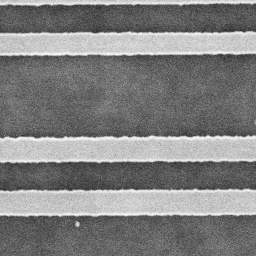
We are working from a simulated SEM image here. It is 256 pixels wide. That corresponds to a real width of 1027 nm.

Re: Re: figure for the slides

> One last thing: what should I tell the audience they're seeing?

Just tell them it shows lines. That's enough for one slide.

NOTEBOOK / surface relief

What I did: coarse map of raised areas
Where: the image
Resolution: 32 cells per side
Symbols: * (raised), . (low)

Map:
*******.*....*........*.........
................................
................................
................................
********************************
********************************
********************************
................................
................................
................................
................................
................................
................................
................................
................................
................................
................................
********************************
********************************
********************************
................................
................................
................................
................................
********************************
********************************
********************************
................................
................................
................................
................................
................................